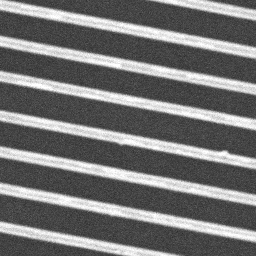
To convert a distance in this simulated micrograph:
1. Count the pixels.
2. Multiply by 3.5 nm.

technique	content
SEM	parallel lines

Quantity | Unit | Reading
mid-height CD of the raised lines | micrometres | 0.0297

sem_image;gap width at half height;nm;95.5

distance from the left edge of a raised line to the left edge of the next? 127 nm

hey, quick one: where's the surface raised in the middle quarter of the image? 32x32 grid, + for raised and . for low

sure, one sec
............+++++++++...........
.................++++++++++.....
......................++++++++++
...........................+++++
................................
++..............................
+++++++.........................
..+++++++++++...................
.......+++++++++++..............
............+++++++++++.........
..................++++++++++....
........................++++++++
.............................+++
................................
................................
+++.............................
+++++++++.......................
...+++++++++++..................
........+++++++++++.............
.............+++++++++++........
...................+++++++++++..
........................++++++++
.............................+++
................................
+++.............................
++++++++........................
...++++++++++...................
........+++++++++++.............
.............+++++++++++........
..................+++++++++++...
........................++++++++
.............................+++